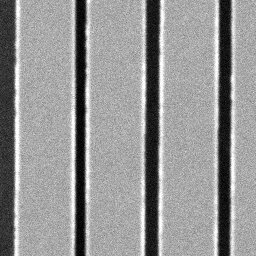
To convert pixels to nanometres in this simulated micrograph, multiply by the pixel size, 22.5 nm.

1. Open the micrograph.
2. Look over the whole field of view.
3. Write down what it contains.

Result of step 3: lines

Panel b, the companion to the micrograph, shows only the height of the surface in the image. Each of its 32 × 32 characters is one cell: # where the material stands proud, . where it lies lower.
..#######..#######..#######..###
..#######..#######..#######..###
..#######..#######..#######..###
..#######..#######..#######..###
..#######..#######..#######..###
..#######..#######..#######..###
..#######..#######..#######..###
..#######..#######..#######..###
..#######..#######..#######..###
..#######..#######..#######..###
..#######..#######..#######..###
..#######..#######..#######..###
..#######..#######..#######..###
..#######..#######..#######..###
..#######..#######..#######..###
..#######..#######..#######..###
..#######..#######..#######..###
..#######..#######..#######..###
..#######..#######..#######..###
..#######..#######..#######..###
..#######..#######..#######..###
..#######..#######..#######..###
..#######..#######..#######..###
..#######..#######..#######..###
..#######..#######..#######..###
..#######..#######..#######..###
..#######..#######..#######..###
..#######..#######..#######..###
..#######..#######..#######..###
..#######..#######..#######..###
..#######..#######..#######..###
..#######..#######..#######..###